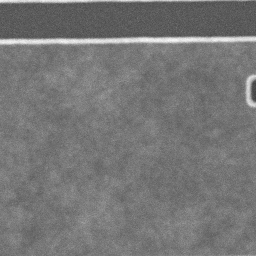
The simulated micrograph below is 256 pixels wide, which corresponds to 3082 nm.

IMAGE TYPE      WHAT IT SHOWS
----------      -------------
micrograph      groups of lines, slits or small figures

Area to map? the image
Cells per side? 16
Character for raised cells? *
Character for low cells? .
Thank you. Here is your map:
................
................
........********
****************
****************
****************
****************
****************
****************
****************
****************
****************
****************
****************
****************
****************